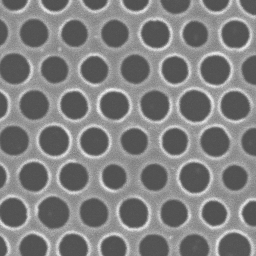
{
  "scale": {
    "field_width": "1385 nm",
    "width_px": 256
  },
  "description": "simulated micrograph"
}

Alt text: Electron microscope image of a regular array of holes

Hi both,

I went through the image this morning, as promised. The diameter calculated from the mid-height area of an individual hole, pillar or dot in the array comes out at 157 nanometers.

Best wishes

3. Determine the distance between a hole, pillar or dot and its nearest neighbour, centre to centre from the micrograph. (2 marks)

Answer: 216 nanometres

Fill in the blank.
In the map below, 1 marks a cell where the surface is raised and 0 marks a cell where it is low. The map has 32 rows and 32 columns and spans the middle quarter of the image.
01110000000111000000011100000001
01110000000111000000001100000001
01110000000111000000011100000001
01111000001111100000011110000001
11111100011111110000111111000011
11111111111111111111111111111111
11111111111111111111110111111111
00000111110000011111000001111100
00000111100000001110000000111000
00000011100000001110000000111000
00000011100000001110000000011000
00000011100000001110000000111000
00000011110000001111000000111000
10001111111000011111100001111100
11111111111111111111111111111111
11111111111111111111111111111111
11111000001111110001111111000011
01111000001111100000011110000001
01110000000111000000011100000001
01110000000111000000011100000001
01110000000111000000011110000001
01111000000111100000111110000011
11111100001111110001111111000111
11111111111111111111111111111111
11111111111111111111111111111111
00000111111000111111100011111100
00000011110000011111000000111000
00000011110000001110000000111000
00000011110000001110000000111000
00000011110000001110000000111000
00000111110000011111000001111000
10001111111111111111100011111100